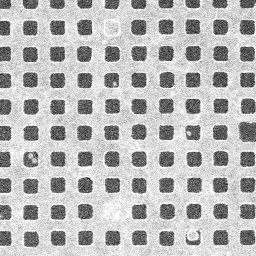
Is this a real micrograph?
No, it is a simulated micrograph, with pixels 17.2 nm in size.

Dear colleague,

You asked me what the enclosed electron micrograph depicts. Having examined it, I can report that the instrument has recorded a regular array of holes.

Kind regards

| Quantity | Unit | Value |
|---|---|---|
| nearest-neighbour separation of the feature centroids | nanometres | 450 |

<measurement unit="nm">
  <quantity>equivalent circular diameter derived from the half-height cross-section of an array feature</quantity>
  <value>298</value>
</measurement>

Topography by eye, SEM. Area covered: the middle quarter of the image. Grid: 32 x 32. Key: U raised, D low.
UUUUUUUUUUUUUUUUUUUUUUUUUUUUUUUU
UUUUUUUUUUUUUUUUUUUUUUUUUUUUUUUU
UUUUDDDUUUDDDDUUUDDDDUUUDDDUUUDD
UUUDDDDUUUDDDDUUUDDDDUUUDDDDUUDD
UUUDDDDUUUDDDDUUUDDDDUUUDDDDUUDD
UUUDDDDUUUDDDDUUUDDDUUUUDDDUUUUD
UUUUUUUUUUUUUUUUUUUUUUUUUUUUUUUU
UUUUUUUUUUUUUUUUUUUUUUUUUUUUUUUU
UUUUUUUUUUUDDUUUUUDDUUUUDDDUUUUD
UUUDDDDUUUDDDDUUUDDDDUUDDDDUUUDD
DUUDDDDUUUDDDDUUUDDDDUUDDDDDUUDD
DUUDDDDUUUDDDDUUUDDDDUUDDDDUUUDD
UUUUDDDUUUUDDUUUUUDDUUUUDDUUUUUD
UUUUUUUUUUUUUUUUUUUUUUUUUUUUUUUU
UUUUUUUUUUUUUUUUUUUUUUUUUUUUUUUU
UUUUDDDUUUDDDDUUUDDDUUUUDDDUUUUD
DUUDDDDUUUDDDDUUUDDDDUUDDDDDUUDD
DUUDDDDUUUDDDDUUUDDDDUUDDDDDUUDD
UUUDDDDUUUDDDDUUUDDDDUUUDDDUUUUD
UUUUUUUUUUUUUUUUUUUUUUUUUUUUUUUU
UUUUUUUUUUUUUUUUUUUUUUUUUUUUUUUU
UUUUUUUUUUUUUUUUUUUUUUUUUUUUUUUU
UUUDDDDUUUDDDDUUUDDDDUUUDDDDUUUD
DUUDDDDUUUDDDDUUUDDDDUUUDDDDUUDD
DUUDDDDUUUDDDDUUUDDDDUUUDDDDUUUD
UUUUDDDUUUUDDDUUUDDDUUUUDDDUUUUD
UUUUUUUUUUUUUUUUUUUUUUUUUUUUUUUU
UUUUUUUUUUUUUUUUUUUUUUUUUUUUUUUU
UUUUDDDUUUUDDUUUUUDDUUUUDDDUUUUD
DUUDDDDUUUDDDDUUUDDDDUUUDDDDUUUD
DUUDDDDUUUDDDDUUUDDDDUUUDDDDUUUD
UUUDDDDUUUDDDDUUUDDDDUUUDDDDUUUD